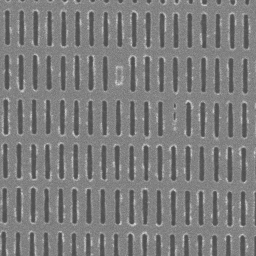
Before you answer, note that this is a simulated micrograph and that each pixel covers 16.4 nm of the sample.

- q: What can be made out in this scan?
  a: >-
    a regular array of holes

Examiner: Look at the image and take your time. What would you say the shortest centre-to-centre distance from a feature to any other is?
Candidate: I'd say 228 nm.